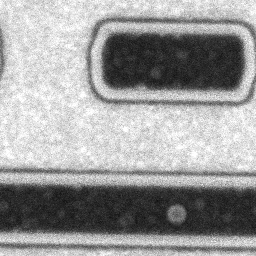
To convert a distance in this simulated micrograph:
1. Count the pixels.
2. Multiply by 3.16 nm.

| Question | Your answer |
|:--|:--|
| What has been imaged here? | one or a few lines or trenches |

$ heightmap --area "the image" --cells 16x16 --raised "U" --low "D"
DDDDDDDDDDDDDDDD
DDDDDDDDDDDDDDDD
DDDDDDUUUUUUUUUU
DDDDDDUUUUUUUUUU
DDDDDDUUUUUUUUUU
DDDDDDUUUUUUUUUD
DDDDDDDDDDDDDDDD
DDDDDDDDDDDDDDDD
DDDDDDDDDDDDDDDD
DDDDDDDDDDDDDDDD
DDDDDDDDDDDDDDDD
UUUUUUUUUUUUUUUU
UUUUUUUUUUUUUUUU
UUUUUUUUUUUUUUUU
UUUUUUUUUUUUUUUU
DDDDDDDDDDDDDDDD